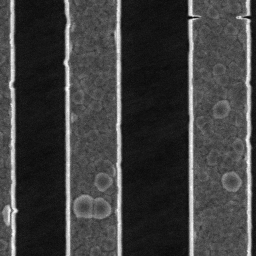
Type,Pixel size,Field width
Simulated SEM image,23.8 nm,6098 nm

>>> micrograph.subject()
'one or a few lines or trenches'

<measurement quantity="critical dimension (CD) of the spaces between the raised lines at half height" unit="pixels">62.9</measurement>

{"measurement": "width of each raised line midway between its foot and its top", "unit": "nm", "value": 1330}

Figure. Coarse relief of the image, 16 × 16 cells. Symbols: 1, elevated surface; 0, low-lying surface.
1000111000001111
1000111000001110
1000111000001111
1000111000001111
1000111000001111
1000111000001111
1000111000001111
1000111000001111
1000111000001111
1000111000001111
1000111000001111
1000111000001111
1000111000001111
1000111000001111
1000111000001111
1000111000001111